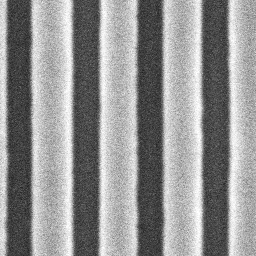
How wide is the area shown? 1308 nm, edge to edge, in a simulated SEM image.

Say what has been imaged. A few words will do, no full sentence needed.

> lines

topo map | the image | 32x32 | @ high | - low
@---@@@@@----@@@@----@@@@----@@@
@---@@@@@----@@@@----@@@@----@@@
@---@@@@@----@@@@----@@@@----@@@
@---@@@@@----@@@@----@@@@----@@@
@---@@@@@----@@@@----@@@@----@@@
@---@@@@@----@@@@----@@@@----@@@
@---@@@@@----@@@@----@@@@----@@@
@---@@@@@----@@@@----@@@@----@@@
@---@@@@@----@@@@----@@@@----@@@
@---@@@@@----@@@@----@@@@----@@@
@---@@@@@----@@@@----@@@@----@@@
@---@@@@@----@@@@----@@@@----@@@
@---@@@@@----@@@@----@@@@----@@@
@---@@@@@----@@@@----@@@@----@@@
@---@@@@@----@@@@----@@@@----@@@
@---@@@@@----@@@@----@@@@----@@@
@---@@@@@----@@@@----@@@@----@@@
@---@@@@@----@@@@----@@@@----@@@
@---@@@@@----@@@@----@@@@----@@@
@---@@@@@----@@@@----@@@@----@@@
@---@@@@@----@@@@----@@@@----@@@
@---@@@@@----@@@@----@@@@----@@@
@---@@@@@----@@@@----@@@@----@@@
@---@@@@@----@@@@----@@@@----@@@
@---@@@@@----@@@@----@@@@----@@@
@---@@@@@----@@@@----@@@@----@@@
@---@@@@@----@@@@----@@@@----@@@
@---@@@@@----@@@@----@@@@----@@@
@---@@@@@----@@@@----@@@@----@@@
@---@@@@@----@@@@----@@@@----@@@
@---@@@@@----@@@@----@@@@----@@@
@---@@@@@----@@@@----@@@@----@@@